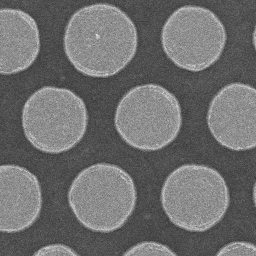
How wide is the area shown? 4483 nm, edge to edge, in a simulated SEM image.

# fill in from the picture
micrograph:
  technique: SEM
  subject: raised bodies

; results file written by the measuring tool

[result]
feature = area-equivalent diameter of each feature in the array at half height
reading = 66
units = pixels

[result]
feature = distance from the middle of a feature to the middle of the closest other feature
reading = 91.4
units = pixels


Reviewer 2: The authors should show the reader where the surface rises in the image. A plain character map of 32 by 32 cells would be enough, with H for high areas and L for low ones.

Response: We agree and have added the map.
LLLLLLLLLLLLLLLLLLLLLLLLLLLLLLLL
HHHLLLLLLLHHHHHLLLLLLLHHHHLLLLLL
HHHHLLLLLHHHHHHHLLLLLHHHHHHLLLLL
HHHHHLLLHHHHHHHHHLLLHHHHHHHHLLLL
HHHHHLLLHHHHHHHHHLLLHHHHHHHHLLLL
HHHHHLLLHHHHHHHHHLLLHHHHHHHHLLLL
HHHHHLLLHHHHHHHHHLLLLHHHHHHHLLLL
HHHHLLLLLHHHHHHHLLLLLLHHHHHLLLLL
HHHLLLLLLLHHHHHLLLLLLLLHHHLLLLLL
LLLLLLLLLLLHHHLLLLLLLLLLLLLLLLLL
LLLLLLLLLLLLLLLLLLLLLLLLLLLLLLLL
LLLLLHHHHLLLLLLLHHHHHLLLLLLHHHHH
LLLHHHHHHHLLLLLHHHHHHHLLLLLHHHHH
LLLHHHHHHHHLLLLHHHHHHHLLLLHHHHHH
LLLHHHHHHHHLLLHHHHHHHHHLLLHHHHHH
LLLHHHHHHHHLLLHHHHHHHHHLLLHHHHHH
LLLHHHHHHHHLLLLHHHHHHHLLLLHHHHHH
LLLLHHHHHHLLLLLLHHHHHHLLLLLHHHHH
LLLLLHHHHLLLLLLLLHHHLLLLLLLLLHHL
LLLLLLLLLLLLLLLLLLLLLLLLLLLLLLLL
LLLLLLLLLLLLLLLLLLLLLLLLLLLLLLLL
HHHHLLLLLLHHHHHHLLLLLLHHHHHLLLLL
HHHHHLLLLHHHHHHHLLLLLHHHHHHHLLLL
HHHHHLLLLHHHHHHHHLLLHHHHHHHHLLLL
HHHHHLLLLHHHHHHHHLLLHHHHHHHHHLLL
HHHHHLLLLHHHHHHHHLLLHHHHHHHHHLLL
HHHHHLLLLHHHHHHHLLLLLHHHHHHHLLLL
HHHHLLLLLLHHHHHHLLLLLHHHHHHLLLLL
HHHLLLLLLLLHHHHLLLLLLLLHHHLLLLLL
LLLLLLLLLLLLLLLLLLLLLLLLLLLLLLLL
LLLLLLLLLLLLLLLLLLHHLLLLLLLLLHHL
LLLLLHHHHLLLLLLLHHHHHLLLLLLHHHHH